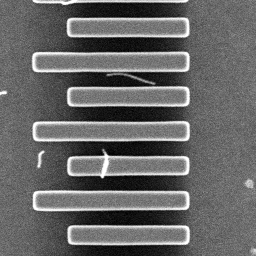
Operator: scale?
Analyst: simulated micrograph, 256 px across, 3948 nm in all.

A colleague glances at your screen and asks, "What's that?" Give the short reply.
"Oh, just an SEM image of groups of lines, slits or small figures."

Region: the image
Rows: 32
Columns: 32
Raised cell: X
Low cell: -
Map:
--------------------------------
--------------------------------
---------XXXXXXXXXXXXXX---------
---------XXXXXXXXXXXXXXX--------
---------XXXXXXXXXXXXXX---------
--------------------------------
--------------------------------
----XXXXXXXXXXXXXXXXXXXX--------
----XXXXXXXXXXXXXXXXXXX---------
--------------------------------
--------------------------------
---------XXXXXXXXXXXXXXX--------
---------XXXXXXXXXXXXXXX--------
--------------------------------
--------------------------------
----XXXXXXXXXXXXXXXXXXX---------
----XXXXXXXXXXXXXXXXXXXX--------
-----XXXXXXXXXXXX---------------
--------------------------------
-------------X------------------
---------XXXXXXXXXXXXXXX--------
---------XXXXXXXXXXXXXX---------
--------------------------------
--------------------------------
----XXXXXXXXXXXXXXXXXXXX--------
----XXXXXXXXXXXXXXXXXXXX--------
--------------------------------
--------------------------------
---------XXXXXXXXXXXXXX---------
---------XXXXXXXXXXXXXXX--------
-------------XXX----------------
--------------------------------